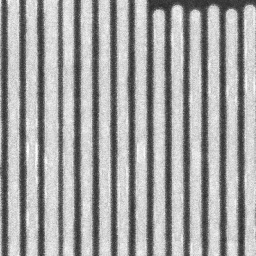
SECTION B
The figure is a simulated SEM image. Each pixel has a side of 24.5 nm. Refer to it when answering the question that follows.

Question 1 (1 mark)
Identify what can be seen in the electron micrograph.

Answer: parallel lines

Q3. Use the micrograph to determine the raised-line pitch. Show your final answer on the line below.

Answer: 446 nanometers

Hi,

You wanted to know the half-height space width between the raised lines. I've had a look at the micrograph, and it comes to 0.233 micrometres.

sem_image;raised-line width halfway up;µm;0.208